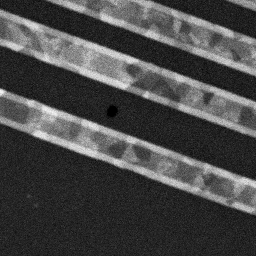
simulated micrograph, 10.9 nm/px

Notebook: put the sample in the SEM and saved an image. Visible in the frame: one or a few lines or trenches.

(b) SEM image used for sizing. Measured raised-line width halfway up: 0.292 µm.